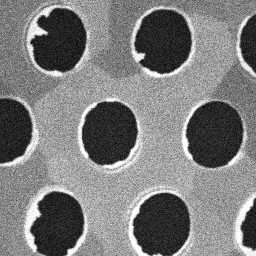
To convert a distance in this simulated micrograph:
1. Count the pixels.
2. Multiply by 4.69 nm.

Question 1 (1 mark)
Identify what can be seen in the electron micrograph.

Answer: holes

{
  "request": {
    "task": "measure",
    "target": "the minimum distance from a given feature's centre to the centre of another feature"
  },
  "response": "488 nanometres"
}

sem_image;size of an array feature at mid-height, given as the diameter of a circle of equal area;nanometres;283